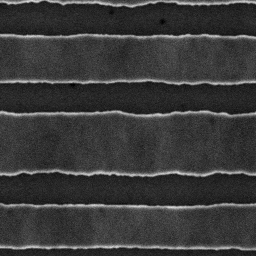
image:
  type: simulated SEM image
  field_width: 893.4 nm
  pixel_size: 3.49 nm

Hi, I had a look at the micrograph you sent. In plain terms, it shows lines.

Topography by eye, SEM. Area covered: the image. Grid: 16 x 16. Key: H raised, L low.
LLLLLLLLLLLLLLLL
LLLLLLLLLLLLLLLL
HHHHHHHHHHHHHHHH
HHHHHHHHHHHHHHHH
HHHHHHHHHHHHHHHH
LLLLLLLLLLLLLLLL
LLLLLLLLLLLLLLLL
HHHHHHHHHHHHHHHH
HHHHHHHHHHHHHHHH
HHHHHHHHHHHHHHHH
HHHHHHHHHHHHHHHH
LLLLLLLLLLLLLLLL
LLLLLLLLLLLLLLLL
HHHHHHHHHHHHHHHH
HHHHHHHHHHHHHHHH
HHLHHLLLLLHHHHHH